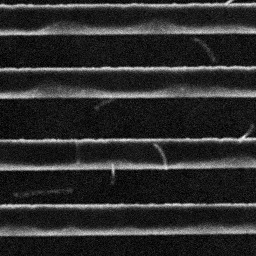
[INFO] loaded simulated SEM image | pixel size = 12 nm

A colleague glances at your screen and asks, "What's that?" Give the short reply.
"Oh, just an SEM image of lines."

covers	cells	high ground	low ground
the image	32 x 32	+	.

.......................++++.++++
++++++++++++++++++++++++++++++++
++++++++++++++++++++++++++++++++
++++++++++++++++++++++++++++++++
................................
................................
................................
................................
.............+++++.++.++++++++++
++++++++++++++++++++++++++++++++
++++++++++++++++++++++++++++++++
++++++++++++++++++++++++++++++++
................................
................................
................................
................................
................................
.....++...++++++++++++++++++++++
++++++++++++++++++++++++++++++++
++++++++++++++++++++++++++++++++
++++++++++++++++++++++++++++++++
................................
................................
................................
................................
................................
++++++++++++++++++++++++++++++++
++++++++++++++++++++++++++++++++
++++++++++++++++++++++++++++++++
................................
................................
................................